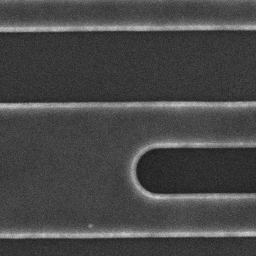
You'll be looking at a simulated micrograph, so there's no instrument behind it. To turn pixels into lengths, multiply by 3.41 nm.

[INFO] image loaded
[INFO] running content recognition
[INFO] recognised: groups of lines, slits or small figures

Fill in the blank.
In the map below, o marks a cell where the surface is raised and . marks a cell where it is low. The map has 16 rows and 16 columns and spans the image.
oooooooooooooooo
oooooooooooooooo
................
................
................
................
.........oooo.oo
oooooooooooooooo
oooooooooooooooo
ooooooooo.......
oooooooo........
ooooooooo.......
oooooooooooooooo
oooooooooooooooo
oooooooooooooooo
................